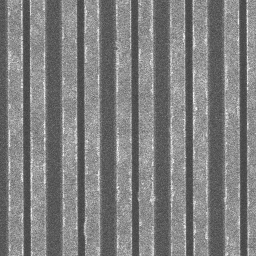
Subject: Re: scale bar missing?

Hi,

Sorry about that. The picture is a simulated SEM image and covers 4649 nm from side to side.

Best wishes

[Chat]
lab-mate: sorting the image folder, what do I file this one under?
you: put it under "parallel lines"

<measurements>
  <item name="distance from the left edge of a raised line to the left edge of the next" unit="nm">492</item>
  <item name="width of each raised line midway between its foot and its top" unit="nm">302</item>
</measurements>